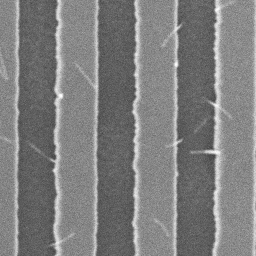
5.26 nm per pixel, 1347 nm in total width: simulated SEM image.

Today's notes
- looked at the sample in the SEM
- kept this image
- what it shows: lines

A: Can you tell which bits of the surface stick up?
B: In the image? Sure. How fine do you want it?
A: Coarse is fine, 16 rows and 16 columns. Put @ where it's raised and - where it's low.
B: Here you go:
@---@@--@@@--@@@
@---@@--@@@--@@@
@---@@--@@@--@@@
@---@@--@@@--@@@
@---@@--@@@--@@@
@--@@@--@@@--@@@
@--@@@--@@@--@@@
@---@@--@@@--@@@
@--@@@--@@@--@@@
@--@@@--@@@--@@@
@--@@@--@@@--@@@
@--@@@--@@@--@@@
@---@@--@@@--@@@
@--@@@--@@@--@@@
@--@@@--@@@---@@
@--@@@--@@@--@@@